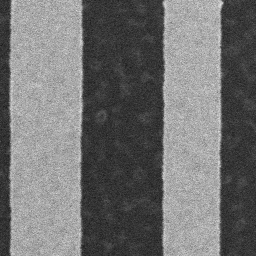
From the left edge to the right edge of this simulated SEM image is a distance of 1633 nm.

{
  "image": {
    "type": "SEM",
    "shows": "one or a few lines or trenches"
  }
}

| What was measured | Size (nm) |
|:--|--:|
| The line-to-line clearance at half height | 529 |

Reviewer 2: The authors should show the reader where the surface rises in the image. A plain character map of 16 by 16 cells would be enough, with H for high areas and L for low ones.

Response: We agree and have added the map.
LHHHHLLLLLHHHHLL
LHHHHLLLLLHHHHLL
LHHHHLLLLLHHHHLL
LHHHHLLLLLHHHHLL
LHHHHLLLLLHHHHLL
LHHHHLLLLLHHHHLL
LHHHHLLLLLHHHHLL
LHHHHLLLLLHHHHLL
LHHHHLLLLLHHHHLL
LHHHHLLLLLHHHHLL
LHHHHLLLLLHHHHLL
LHHHHLLLLLHHHHLL
LHHHHLLLLLHHHHLL
LHHHHLLLLLHHHHLL
LHHHHLLLLLHHHHLL
LHHHHLLLLLHHHHLL